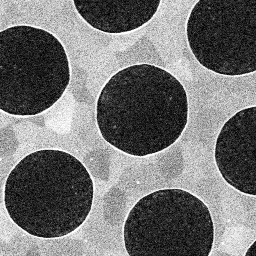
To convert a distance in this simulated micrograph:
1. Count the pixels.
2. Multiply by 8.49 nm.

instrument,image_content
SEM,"holes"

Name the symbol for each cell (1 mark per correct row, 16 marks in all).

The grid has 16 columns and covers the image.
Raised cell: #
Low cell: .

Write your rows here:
#####.....##....
######...###....
....########....
....########....
....###....##...
....##.....#####
...###......####
######......##..
######.....###..
##..####..###...
#....#########..
......########..
......###....###
#....###.....###
##..####.....###
########.....###